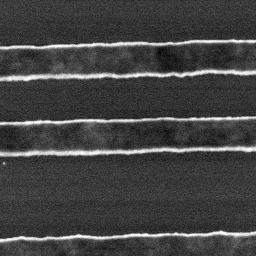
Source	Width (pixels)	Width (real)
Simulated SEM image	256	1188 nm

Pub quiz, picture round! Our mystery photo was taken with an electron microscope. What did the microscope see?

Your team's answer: lines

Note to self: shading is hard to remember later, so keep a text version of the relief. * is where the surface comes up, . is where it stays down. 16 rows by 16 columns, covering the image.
................
................
................
****************
****************
................
................
.........*******
****************
*********.......
................
................
................
................
................
****************